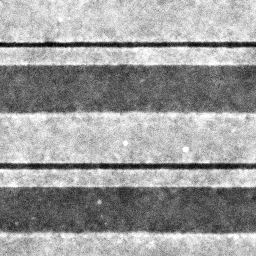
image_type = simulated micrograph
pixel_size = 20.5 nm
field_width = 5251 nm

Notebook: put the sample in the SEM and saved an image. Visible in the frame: lines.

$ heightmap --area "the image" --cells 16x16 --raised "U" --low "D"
UUUUUUUUUUUUUUUU
UUUUUUUUUUUUUUUU
UUUUUUUUUUUUUUUU
UUUUUUUUUUUUUUUU
DDDDDDDDDDDDDDDD
DDDDDDDDDDDDDDDD
DDDDDDDDDDDDDDDD
UUUUUUUUUUUUUUUU
UUUUUUUUUUUUUUUU
UUUUUUUUUUUUUUUU
UUUUUUUUUUUUUUUU
UUUUUUUUUUUUUUUU
DDDDDDDDDDDDDDDD
DDDDDDDDDDDDDDDD
DDDDDDDDDDDDDDDD
UUUUUUUUUUUUUUUU